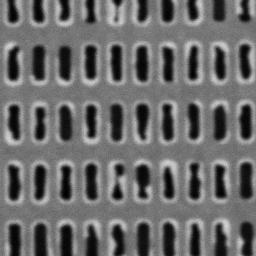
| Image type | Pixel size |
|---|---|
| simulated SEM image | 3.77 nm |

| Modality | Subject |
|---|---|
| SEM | a regular array of holes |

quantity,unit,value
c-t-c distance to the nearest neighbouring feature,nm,95.7